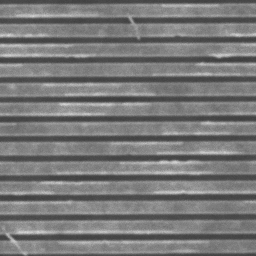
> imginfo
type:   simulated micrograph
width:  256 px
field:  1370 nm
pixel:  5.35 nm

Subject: parallel lines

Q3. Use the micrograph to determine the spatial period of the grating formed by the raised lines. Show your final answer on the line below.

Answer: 0.105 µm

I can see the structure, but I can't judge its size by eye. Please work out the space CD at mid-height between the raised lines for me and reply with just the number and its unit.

40.1 nm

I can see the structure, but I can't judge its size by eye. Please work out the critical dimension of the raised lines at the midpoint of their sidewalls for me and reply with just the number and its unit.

64.9 nm